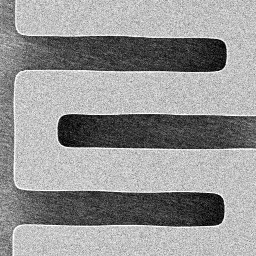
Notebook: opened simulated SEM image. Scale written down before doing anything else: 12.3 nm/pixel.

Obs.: groups of lines, slits or small figures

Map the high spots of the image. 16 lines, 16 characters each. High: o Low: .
.ooooooooooooooo
.ooooooooooooooo
..............oo
..............oo
.oooooooooo..ooo
.ooooooooooooooo
.ooooooooooooooo
.ooo............
.ooo............
.ooooooooooooooo
.ooooooooooooooo
.ooooooooooooooo
..............oo
..............oo
.ooooooooooooooo
.ooooooooooooooo